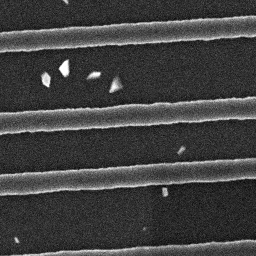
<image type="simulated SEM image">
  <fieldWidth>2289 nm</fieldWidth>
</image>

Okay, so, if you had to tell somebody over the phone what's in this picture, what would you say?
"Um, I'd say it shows lines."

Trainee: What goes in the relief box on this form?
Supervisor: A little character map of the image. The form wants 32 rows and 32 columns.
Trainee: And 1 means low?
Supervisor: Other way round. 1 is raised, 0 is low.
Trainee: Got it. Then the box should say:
00000000000000000000000000000000
00000000000000000000000000000000
00000000000000000000000011111111
00000000011111111111111111111111
11111111111111111111111111111111
11111111111111110000000000000000
00000000000000000000000000000000
00000000000000000000000000000000
00000000000000000000000000000000
00000100000000000000000000000000
00000000000000100000000000000000
00000000000000000000000000000000
00000000000000000000000000011111
00000000000001111111111111111111
11111111111111111111111111111111
11111111111111111111000000000000
11100000000000000000000000000000
00000000000000000000000000000000
00000000000000000000000000000000
00000000000000000000000000000000
00000000000000000000111111111111
00000011111111111111111111111111
11111111111111111111111111111000
11111111111111000000000000000000
00000000000000000000000000000000
00000000000000000000000000000000
00000000000000000000000000000000
00000000000000000000000000000000
00000000000000000000000000000000
00000000000000000000000000000000
00000000000000000000000001111111
00000001111111111111111111111111